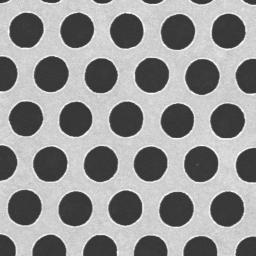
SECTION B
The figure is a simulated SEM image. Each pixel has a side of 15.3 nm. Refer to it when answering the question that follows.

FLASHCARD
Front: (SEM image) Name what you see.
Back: a regular array of holes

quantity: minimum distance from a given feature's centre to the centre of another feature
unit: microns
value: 0.767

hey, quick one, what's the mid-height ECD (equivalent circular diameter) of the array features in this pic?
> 539 nanometres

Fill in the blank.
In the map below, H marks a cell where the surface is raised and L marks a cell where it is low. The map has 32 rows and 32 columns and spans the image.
HHHHHHHHHHHHHHHHHHHHHHHHLLHHHHHL
HHHHHHHHHHHHHHHHHHHHHHHHHHHHHHHH
HHLLLHHHLLLHHHLLLLHHHLLLHHHLLLHH
HLLLLLHHLLLLHHLLLLHHLLLLHHHLLLLH
HLLLLHHHLLLLHHLLLLHHLLLLHHHLLLLH
HHLLLHHHLLLHHHLLLHHHHLLLHHHLLLHH
HHHHHHHHHHHHHHHHHHHHHHHHHHHHHHHH
LLHHHLLLHHHHLLHHHHLLHHHHHLHHHHHL
LLHHLLLLHHHLLLLHHLLLLHHLLLLHHHLL
LLHHLLLLLHHLLLLHHLLLLHHLLLLHHLLL
LLHHHLLLHHHLLLHHHLLLLHHLLLLHHHLL
HHHHHHLHHHHHLHHHHHLLHHHHLLHHHHLL
HHHHHHHHHHHHHHHHHHHHHHHHHHHHHHHH
HHLLLHHHLLLHHHLLLHHHHLLLHHHLLLHH
HLLLLHHLLLLLHHLLLLHHLLLLHHLLLLHH
HLLLLHHLLLLHHHLLLLHHLLLLHHLLLLLH
HHLLLHHHLLLHHHLLLHHHHLLLHHHLLLHH
HHHHHHHHHHHHHHHHHHHHHHHHHHHHHHHH
LHHHHLLHHHHHLLHHHHLLHHHHLLHHHHHL
LLHHLLLLHHHLLLLHHLLLLHHLLLLHHHLL
LLHHLLLLHHLLLLLHHLLLLHHLLLLHHLLL
LLHHLLLLHHHLLLHHHLLLLHHLLLLHHHLL
LHHHHLLHHHHHLHHHHHLLHHHHLLHHHHLL
HHHHHHHHHHHHHHHHHHHHHHHHHHHHHHHH
HHLLLHHHLLLHHHLLLHHHHLLHHHHLLLHH
HLLLLHHLLLLLHHLLLLHHLLLLHHLLLLHH
HLLLLHHLLLLLHHLLLLHHLLLLHHLLLLLH
HLLLLHHHLLLHHHLLLHHHLLLLHHHLLLHH
HHHHHHHHHHHHHHHHHHHHHHHHHHHHHHHH
LHHHHLLHHHHHLHHHHHLLHHHHHHHHHHHH
LLHHLLLLHHHLLLHHHLLLLHHLLLLHHHLL
LLHHLLLLHHLLLLLHHLLLLHHLLLLHHLLL